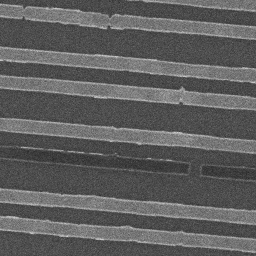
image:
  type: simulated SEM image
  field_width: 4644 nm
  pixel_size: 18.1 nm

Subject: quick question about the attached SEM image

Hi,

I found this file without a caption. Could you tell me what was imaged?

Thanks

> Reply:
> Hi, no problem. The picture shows parallel lines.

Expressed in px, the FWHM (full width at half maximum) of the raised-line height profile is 12.5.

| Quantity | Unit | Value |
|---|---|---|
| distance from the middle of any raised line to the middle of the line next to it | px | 35.3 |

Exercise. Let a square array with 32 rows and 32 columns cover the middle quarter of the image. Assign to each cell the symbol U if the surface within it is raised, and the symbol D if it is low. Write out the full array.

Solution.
DDDDDUUUUUUUUUUUUUUUUUUUUUUUUUUU
DDDDDDDDDDDDDDDDUUUUUUUUUUUUUUUU
DDDDDDDDDDDDDDDDDDDDDDDDDUUUUUUU
DDDDDDDDDDDDDDDDDDDDDDDDDDDDDDDD
UUDDDDDDDDDDDDDDDDDDDDDDDDDDDDDD
UUUUUUUUUUUUUUDDDDDDDDDDDDDDDDDD
UUUUUUUUUUUUUUUUUUUUUUUUUDDDDUDD
DDDUUUUUUUUUUUUUUUUUUUUUUUUUUUUU
DDDDDDDDDDDDDDUUUUUUUUUUUUUUUUUU
DDDDDDDDDDDDDDDDDDDDDDDDDDUUUDUU
DDDDDDDDDDDDDDDDDDDDDDDDDDDDDDDD
DDDDDDDDDDDDDDDDDDDDDDDDDDDDDDDD
DDDDDDDDDDDDDDDDDDDDDDDDDDDDDDDD
DDDDDDDDDDDDDDDDDDDDDDDDDDDDDDDD
DDDDDDDDDDDDDDDDDDDDDDDDDDDDDDDD
UUUUUUDDDDDDDDDDDDDDDDDDDDDDDDDD
UUUUUUUUUUUUUUUUUDDDDDDDDDDDDDDD
UUUUUUUUUUUUUUUUUUUUUUUUUUUUDDDD
DDDDDDUUUUUUUUUUUUUUUUUUUUUUUUUU
DDDDDDDDDDDDDDDDDDUUUUUUUUUUUUUU
DDDDDDDDDDDDDDDDDDDDDDDDDDDDDDDU
DDDDDDDDDDDDDDDDDDDDDDDDDDDDDDDD
UUUUUUUDDDDDDDDDDDDDDDDDDDDDDDDD
UUUUUUUUUUUUUUUDDDDDDDDDDDDDDDDD
UUUUUUUUUUUUUUUUUUUUUUUUUUUDDDDD
DDDDDUUUUUUUUUUUUUUUUUUUUUUUUUUD
DDDDDDDDDDDDDDDDDDDUUUUUUUUUUUUD
DDDDDDDDDDDDDDDDDDDDDDDDDDDDDDUD
DDDDDDDDDDDDDDDDDDDDDDDDDDDDDDDD
DDDDDDDDDDDDDDDDDDDDDDDDDDDDDDDD
DDDDDDDDDDDDDDDDDDDDDDDDDDDDDDDD
DDDDDDDDDDDDDDDDDDDDDDDDDDDDDDDD